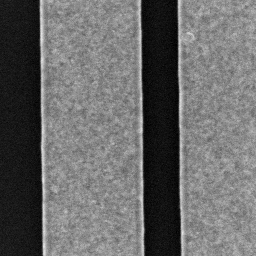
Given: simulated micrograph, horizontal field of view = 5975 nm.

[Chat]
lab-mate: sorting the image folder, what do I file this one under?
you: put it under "wiring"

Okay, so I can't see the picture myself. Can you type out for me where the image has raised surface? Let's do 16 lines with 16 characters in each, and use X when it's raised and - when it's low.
---XXXXXX--XXXXX
---XXXXXX--XXXXX
---XXXXXX--XXXXX
---XXXXXX--XXXXX
---XXXXXX--XXXXX
---XXXXXX--XXXXX
---XXXXXX--XXXXX
---XXXXXX--XXXXX
---XXXXXX--XXXXX
---XXXXXX--XXXXX
---XXXXXX--XXXXX
---XXXXXX--XXXXX
---XXXXXX--XXXXX
---XXXXXX--XXXXX
---XXXXXX--XXXXX
---XXXXXX--XXXXX